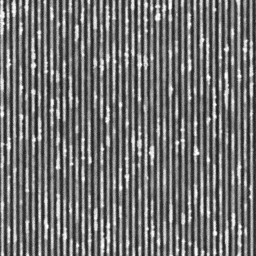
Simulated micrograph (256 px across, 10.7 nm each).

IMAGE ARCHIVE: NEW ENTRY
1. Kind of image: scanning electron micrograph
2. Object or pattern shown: parallel lines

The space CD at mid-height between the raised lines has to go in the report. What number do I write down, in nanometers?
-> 41.6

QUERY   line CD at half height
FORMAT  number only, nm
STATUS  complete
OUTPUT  21.5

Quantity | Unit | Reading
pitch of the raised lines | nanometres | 66.9